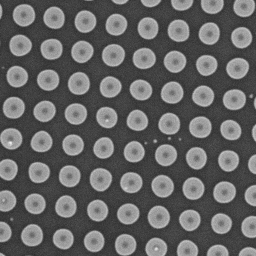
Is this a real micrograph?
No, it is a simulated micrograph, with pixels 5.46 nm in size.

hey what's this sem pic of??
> an array of small figures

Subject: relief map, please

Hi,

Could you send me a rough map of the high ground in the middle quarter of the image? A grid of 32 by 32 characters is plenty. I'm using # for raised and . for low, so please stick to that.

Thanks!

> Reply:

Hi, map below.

..................####...#####..
..........................###...
...##...........................
..####....###...................
.#####...#####...####......#....
.#####...#####...#####...####...
..####...#####...#####...#####..
...##.....###....#####..######..
..................###....####...
..........................##....
.####...........................
#####....###....................
######..#####...####.....##.....
.####...#####...#####...#####...
.####....####...#####...#####...
.........###....#####...#####..#
..................#.....#####..#
..........................#.....
####......#.....................
#####...####.....#..............
#####...####....###.....###.....
#####..#####...#####...#####...#
.###....####...#####...#####...#
.........#.....#####...#####...#
.......................####....#
.#.............................#
####....###.....................
####...#####...###..............
####...#####..#####....###......
####...#####..######..#####...##
##.....####...#####...#####...##
........##.....####...#####...##